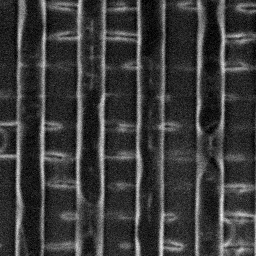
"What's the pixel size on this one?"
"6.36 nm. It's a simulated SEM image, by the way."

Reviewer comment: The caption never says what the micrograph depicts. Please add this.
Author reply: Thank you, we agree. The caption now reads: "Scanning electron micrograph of wiring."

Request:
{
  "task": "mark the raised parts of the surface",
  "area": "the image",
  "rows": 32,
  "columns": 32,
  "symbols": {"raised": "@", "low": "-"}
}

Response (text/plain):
---@@-----@@@----@@@-----@@@----
---@@@----@@@----@@@-----@@@----
---@@@----@@@----@@@@----@@@----
--@@@@----@@@----@@@@----@@@----
--@@@@----@@@----@@@@----@@@----
--@@@-----@@@----@@@@----@@@----
--@@@-----@@@----@@@-----@@@----
--@@@-----@@@----@@@-----@@@----
--@@@-----@@@----@@@-----@@@----
--@@@-----@@@----@@@-----@@@----
--@@@-----@@@----@@@-----@@@----
--@@@-----@@@----@@@-----@@@----
--@@@-----@@@----@@@-----@@@----
--@@@-----@@@----@@@-----@@@----
--@@@-----@@@----@@@-----@@@----
--@@@-----@@@----@@@-----@@@----
--@@@-----@@@----@@@-----@@@----
--@@@-----@@@----@@@-----@@-----
--@@@-----@@@----@@@-----@@-----
--@@@-----@@@----@@@-----@@@----
--@@@-----@@@----@@@-----@@@----
--@@@-----@@@----@@@-----@@@----
--@@@-----@@@----@@@-----@@@----
--@@@-----@@@----@@@-----@@@----
--@@@-----@@@----@@@-----@@@----
--@@@-----@@@----@@@-----@@@----
--@@@-----@@@----@@@-----@@@----
--@@@-----@@-----@@@-----@@@----
--@@@-----@@-----@@@-----@@@----
--@@@-----@@-----@@@-----@@@----
--@@@-----@@@----@@@-----@@@----
--@@@-----@@-----@@@-----@@-----